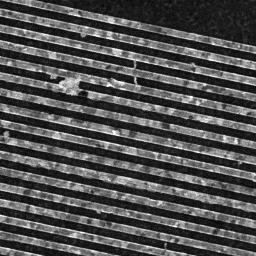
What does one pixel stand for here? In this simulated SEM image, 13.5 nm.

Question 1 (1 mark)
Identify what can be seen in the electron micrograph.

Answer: parallel lines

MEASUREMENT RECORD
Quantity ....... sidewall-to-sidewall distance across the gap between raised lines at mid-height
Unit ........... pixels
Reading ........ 8.81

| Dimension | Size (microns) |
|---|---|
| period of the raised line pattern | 0.21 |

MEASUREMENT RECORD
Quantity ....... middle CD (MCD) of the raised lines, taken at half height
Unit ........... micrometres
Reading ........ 0.0926